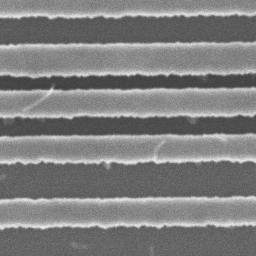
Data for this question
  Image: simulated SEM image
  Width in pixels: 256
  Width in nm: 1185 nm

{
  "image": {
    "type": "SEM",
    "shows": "lines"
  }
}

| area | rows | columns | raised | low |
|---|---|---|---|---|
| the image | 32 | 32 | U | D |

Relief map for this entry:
UUUUUUUUUUUUUUUUUUUUUUUUUUUUUUUU
UUUUUUUUUUUUUUUUUUUUUUUUUUUUUUUU
DDDDDDDDDDDDDDDDDDDDDDDDDDDDDDDD
DDDDDDDDDDDDDDDDDDDDDDDDDDDDDDDD
DDDDDDDDDDDDDDDDDDDDDDDDDDDDDDDD
DDDDDDDDDUUDDUUUUUUUUUUUUUUUUUUU
UUUUUUUUUUUUUUUUUUUUUUUUUUUUUUUU
UUUUUUUUUUUUUUUUUUUUUUUUUUUUUUUU
UUUUUUUUUUUUUUUUUUUUUUUUUUUUUUUU
DUUUUUUDUDUDDDDDDDDDDDDDDDDDDDDD
DDDDDDDDDDDDDDDDDDDDDDDDDDDDDDDD
UUUUUUUUUUUUUUUUUUUUUUUUUUUUUUUU
UUUUUUUUUUUUUUUUUUUUUUUUUUUUUUUU
UUUUUUUUUUUUUUUUUUUUUUUUUUUUUUUU
UUUUUUUUUUDUUUUUUUUUUUDUUUUUUDDU
DDDDDDDDDDDDDDDDDDDDDDDDDDDDDDDD
DDDDDDDDDDDDDDDDDDDDDDDDDDDDDDDD
UUUUUUUUUUUUUUUUUUUUUUUUUUUUUUUU
UUUUUUUUUUUUUUUUUUUUUUUUUUUUUUUU
UUUUUUUUUUUUUUUUUUUUUUUUUUUUUUUU
DDDDDDDDDDDDDDDDUDDDDDDDDDDDDDDD
DDDDDDDDDDDDDDDDDDDDDDDDDDDDDDDD
DDDDDDDDDDDDDDDDDDDDDDDDDDDDDDDD
DDDDDDDDDDDDDDDDDDDDDDDDDDDDDDDD
DDDDDDDDDDDDDDDDDDDDDDDDDDDDDDDD
UUUUUUUUUUUUUUUUUUUUUUUUUUUUUUUU
UUUUUUUUUUUUUUUUUUUUUUUUUUUUUUUU
UUUUUUUUUUUUUUUUUUUUUUUUUUUUUUUU
UDDDDDDDDDDDDDDDDDDDDDDDDDDDDDDD
DDDDDDDDDDDDDDDDDDDDDDDDDDDDDDDD
DDDDDDDDDDDDDDDDDDDDDDDDDDDDDDDD
DDDDDDDDDDDDDDDDDDDDDDDDDDDDDDDD